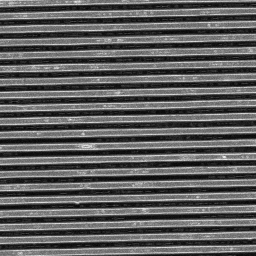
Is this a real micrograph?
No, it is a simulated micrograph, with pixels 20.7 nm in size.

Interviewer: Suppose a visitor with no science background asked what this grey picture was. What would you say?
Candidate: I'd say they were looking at parallel lines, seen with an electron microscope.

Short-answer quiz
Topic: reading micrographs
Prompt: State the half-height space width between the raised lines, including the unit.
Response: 6.5 px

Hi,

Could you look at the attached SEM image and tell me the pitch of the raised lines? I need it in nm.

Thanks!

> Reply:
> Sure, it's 273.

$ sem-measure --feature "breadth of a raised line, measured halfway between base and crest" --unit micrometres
0.137